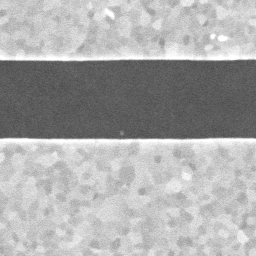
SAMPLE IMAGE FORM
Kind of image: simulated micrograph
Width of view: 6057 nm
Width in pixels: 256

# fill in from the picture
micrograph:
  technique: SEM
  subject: wiring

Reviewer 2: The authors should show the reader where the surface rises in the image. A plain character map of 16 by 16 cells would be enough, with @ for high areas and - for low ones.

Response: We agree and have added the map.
@@@@@@@@@@@@@@@@
@@@@@@@@@@@@@@@@
@@@@@@@@@@@@@@@@
@@@@@@@@@@@@@@@@
----------------
----------------
----------------
----------------
----------------
@@@@@@@@@@@@@@@@
@@@@@@@@@@@@@@@@
@@@@@@@@@@@@@@@@
@@@@@@@@@@@@@@@@
@@@@@@@@@@@@@@@@
@@@@@@@@@@@@@@@@
@@@@@@@@@@@@@@@@